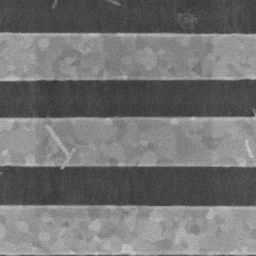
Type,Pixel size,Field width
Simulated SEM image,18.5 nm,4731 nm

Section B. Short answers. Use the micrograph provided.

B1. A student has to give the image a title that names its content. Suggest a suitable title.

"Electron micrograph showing lines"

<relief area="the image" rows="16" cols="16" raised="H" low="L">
LLLLLLLLLLLLLLLL
LLLLLLLLLLLLLLLL
HHHHHHHHHHHHHHHH
HHHHHHHHHHHHHHHH
HHHHHHHHHHHHHHHH
LLLLLLLLLLLLLLLL
LLLLLLLLLLLLLLLL
HHHHHHHHHHHHHHHH
HHHHHHHHHHHHHHHH
HHHHHHHHHHHHHHHH
LLLLLLLLLLLLLLLL
LLLLLLLLLLLLLLLL
LLLLLLLLLLLLLLLL
HHHHHHHHHHHHHHHH
HHHHHHHHHHHHHHHH
HHHHHHHHHHHHHHHH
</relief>